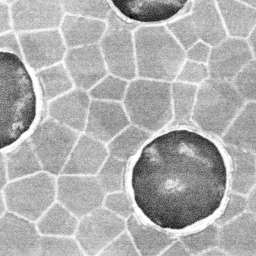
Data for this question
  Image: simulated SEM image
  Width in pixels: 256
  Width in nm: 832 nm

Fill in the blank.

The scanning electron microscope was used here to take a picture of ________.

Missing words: holes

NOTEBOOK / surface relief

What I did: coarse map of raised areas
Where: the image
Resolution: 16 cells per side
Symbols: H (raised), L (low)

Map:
HHHHHHHLLLLHHHHH
HHHHHHHHHHHHHHHH
HHHHHHHHHHHHHHHH
LHHHHHHHHHHHHHHH
LLHHHHHHHHHHHHHH
LLHHHHHHHHHHHHHH
LLHHHHHHHHHHHHHH
LLHHHHHHHHHHHHHH
LHHHHHHHHHLLLHHH
HHHHHHHHHLLLLLHH
HHHHHHHHLLLLLLHH
HHHHHHHHLLLLLLHH
HHHHHHHHLLLLLLHH
HHHHHHHHHLLLLHHH
HHHHHHHHHHHHHHHH
HHHHHHHHHHHHHHHH